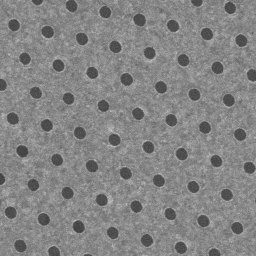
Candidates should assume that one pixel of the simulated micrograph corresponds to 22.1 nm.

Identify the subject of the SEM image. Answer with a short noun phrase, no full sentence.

a regular array of holes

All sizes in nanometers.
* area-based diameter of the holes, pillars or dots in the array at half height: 284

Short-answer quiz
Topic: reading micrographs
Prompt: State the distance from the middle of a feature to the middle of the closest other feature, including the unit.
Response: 751 nanometres